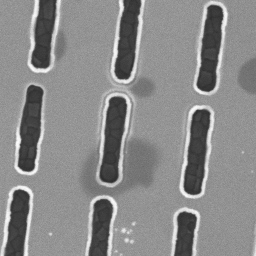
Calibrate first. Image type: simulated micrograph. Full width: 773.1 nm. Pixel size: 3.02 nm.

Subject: holes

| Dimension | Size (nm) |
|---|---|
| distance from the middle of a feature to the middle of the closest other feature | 254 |